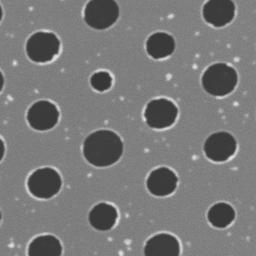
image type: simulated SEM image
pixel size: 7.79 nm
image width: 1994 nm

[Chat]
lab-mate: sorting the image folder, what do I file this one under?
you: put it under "a regular array of holes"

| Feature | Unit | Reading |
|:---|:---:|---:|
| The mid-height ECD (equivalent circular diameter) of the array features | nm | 245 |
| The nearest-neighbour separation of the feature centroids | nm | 526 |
